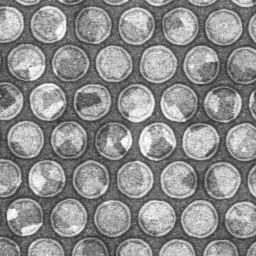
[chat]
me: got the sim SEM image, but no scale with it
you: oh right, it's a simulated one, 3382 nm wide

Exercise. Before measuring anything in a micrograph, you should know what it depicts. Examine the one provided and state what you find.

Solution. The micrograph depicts a regular array of raised bodies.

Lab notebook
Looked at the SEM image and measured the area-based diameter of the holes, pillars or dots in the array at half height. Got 470 nanometers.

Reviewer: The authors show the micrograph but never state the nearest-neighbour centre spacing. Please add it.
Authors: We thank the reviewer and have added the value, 574 nanometres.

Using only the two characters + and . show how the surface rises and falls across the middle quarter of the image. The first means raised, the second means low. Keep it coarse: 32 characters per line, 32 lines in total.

++++++..+++++++++..+++++++++..++
++++++...++++++++..+++++++++..++
+++++....+++++++....+++++++....+
++++......+++++.....++++++.....+
......................++........
......+++........++........+++..
....+++++++....++++++.....++++++
...++++++++...++++++++...+++++++
...+++++++++..++++++++...+++++++
...+++++++++..++++++++..++++++++
...++++++++...++++++++..++++++++
...++++++++...++++++++...+++++++
....++++++.....+++++++...+++++++
.....+++........++++......+++++.
................................
++++......+++++.......++++......
+++++....+++++++....+++++++....+
+++++...++++++++....+++++++...++
+++++...+++++++++..+++++++++..++
+++++...+++++++++..+++++++++..++
+++++...++++++++...++++++++...++
+++++....+++++++...++++++++...++
++++.....++++++.....++++++.....+
...........+++.......++++.......
......++........................
....+++++......++++++.....+++++.
...++++++++...+++++++....+++++++
...++++++++...++++++++...+++++++
...++++++++...++++++++...+++++++
...++++++++...++++++++...+++++++
...++++++++...++++++++...+++++++
...+++++++....+++++++....+++++++